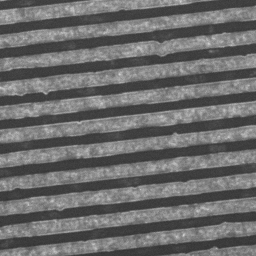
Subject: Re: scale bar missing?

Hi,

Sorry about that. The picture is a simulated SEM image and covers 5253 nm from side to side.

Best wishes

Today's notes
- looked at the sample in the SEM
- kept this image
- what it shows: parallel lines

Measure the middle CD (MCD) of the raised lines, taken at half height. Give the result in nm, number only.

263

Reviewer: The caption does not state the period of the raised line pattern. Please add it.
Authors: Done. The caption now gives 487 nm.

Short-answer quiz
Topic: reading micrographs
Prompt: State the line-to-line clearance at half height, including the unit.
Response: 222 nanometers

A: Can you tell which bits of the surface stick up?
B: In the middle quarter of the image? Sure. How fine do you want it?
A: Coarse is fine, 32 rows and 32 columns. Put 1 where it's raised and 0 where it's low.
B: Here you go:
00000000000000000000011111111111
00000000000011111111111111111111
00011111111111111111111111111111
11111111111111111111111100000000
11111111111111100000000000000000
11111100000000000000000000000000
00000000000000000000000111111111
00000000000000111111111111111111
00000111111111111111111111111111
11111111111111111111111000000000
11111111111111000000000000000000
11111000000000000000000000000111
00000000000000000000001111111111
00000000000001111111111111111111
00000111111111111111111111111110
11111111111111111111110000000000
11111111111111000000000000000000
11111000000000000000000000010011
00000000000000000000011111111111
00000000000011111111111111111111
00001111111111111111111111111110
11111111111111111111110000000000
11111111111110000000000000000000
11110000000000000000000000000011
00000000000000000000011111111111
00000000000011111111111111111111
00011111111111111111111111111100
11111111111111111111100000000000
11111111111100000000000000000000
11100000000000000000000000000001
00000000000000000000111111111111
00000000000111111111111111111111